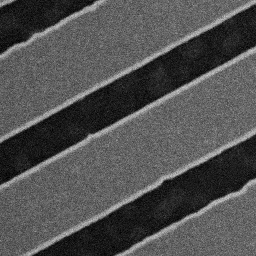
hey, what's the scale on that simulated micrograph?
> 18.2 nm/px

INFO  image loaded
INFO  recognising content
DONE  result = one or a few lines or trenches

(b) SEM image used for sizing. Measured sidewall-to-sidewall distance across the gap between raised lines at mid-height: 758 nm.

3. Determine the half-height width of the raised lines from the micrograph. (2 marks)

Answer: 1330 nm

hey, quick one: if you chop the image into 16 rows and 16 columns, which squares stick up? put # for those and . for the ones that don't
......#########.
....##########..
..##########....
##########.....#
########.....###
######.....#####
####......######
##......########
#.....##########
....##########..
..##########....
##########......
########......##
######......####
####......######
###.....########